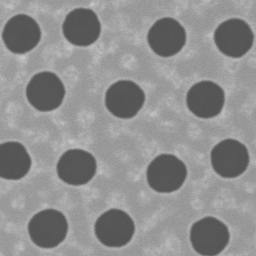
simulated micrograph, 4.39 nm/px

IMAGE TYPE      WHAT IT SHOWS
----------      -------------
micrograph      a regular array of holes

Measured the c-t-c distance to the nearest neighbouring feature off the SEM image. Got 288 nm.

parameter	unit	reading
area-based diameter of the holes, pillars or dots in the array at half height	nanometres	173